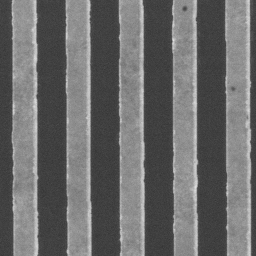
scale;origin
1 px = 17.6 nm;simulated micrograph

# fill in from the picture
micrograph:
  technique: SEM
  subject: lines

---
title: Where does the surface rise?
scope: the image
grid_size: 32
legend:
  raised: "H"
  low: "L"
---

LLHHLLLLHHHLLLLHHHLLLLHHLLLLHHHL
LLHHLLLLHHHLLLLHHHLLLLHHLLLLHHHL
LLHHLLLLHHHLLLLHHHLLLLHHLLLLHHHL
LLHHLLLLHHHLLLLHHHLLLLHHHLLLHHHL
LLHHLLLLHHHLLLLHHHLLLLHHLLLLHHHL
LLHHLLLLHHHLLLLHHHLLLLHHHLLLHHHL
LLHHLLLLHHHLLLLHHHLLLLHHHLLLHHHL
LLHHLLLLHHHLLLLHHHLLLLHHHLLLHHHL
LLHHLLLLHHHLLLLHHHLLLLHHLLLLHHHL
LLHHLLLLHHHLLLLHHHLLLLHHHLLLHHHL
LLHHLLLLHHHLLLLHHHLLLLHHHLLLHHHL
LLHHLLLLHHHLLLLHHHLLLLHHHLLLHHHL
LLHHLLLLHHHLLLLHHHLLLLHHHLLLHHHL
LLHHHLLLHHHLLLLHHHLLLLHHHLLLHHHL
LLHHHLLLHHHLLLLHHHLLLLHHHLLLHHHL
LLHHHLLLHHHLLLLHHHLLLLHHHLLLHHHL
LLHHHLLLHHHLLLLHHHLLLLHHHLLLHHHL
LLHHHLLLHHHLLLLHHHLLLLHHHLLLHHHL
LLHHHLLLHHHLLLLHHHLLLLHHHLLLHHHL
LLHHHLLLHHHLLLLHHHLLLLHHHLLLHHHL
LLHHHLLLHHHLLLLHHHLLLLHHHLLLHHHL
LLHHHLLLHHHLLLLHHHLLLLHHHLLLHHHL
LLHHHLLLHHHLLLLHHHLLLLHHHLLLHHHL
LLHHHLLLHHHLLLLHHHLLLLHHHLLLHHHL
LLHHHLLLHHHLLLLHHHLLLLHHHLLLHHHL
LLHHHLLLLHHLLLLHHHLLLLHHHLLLHHHL
LLHHHLLLHHHLLLLHHHLLLLHHHLLLHHHL
LLHHHLLLHHHLLLLHHHLLLLHHHLLLHHHL
LLHHHLLLLHHLLLLHHHLLLLHHHLLLHHHL
LLHHHLLLLHHLLLLHHHLLLLHHHLLLHHHL
LLHHHLLLLHHLLLLHHHLLLLHHHLLLHHHL
LLHHHLLLHHHLLLLHHHLLLLHHHLLLHHHL